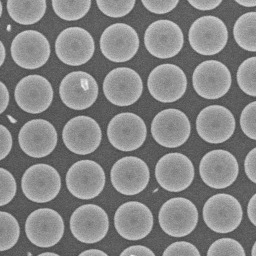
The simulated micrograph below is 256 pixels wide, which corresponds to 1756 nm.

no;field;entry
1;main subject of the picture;an array of small figures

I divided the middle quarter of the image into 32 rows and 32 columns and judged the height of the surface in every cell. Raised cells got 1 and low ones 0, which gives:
00000000000000000000000011110000
00000000000011111000001111111000
01111100000111111100001111111100
11111110001111111110011111111100
11111111001111111110011111111110
11111111001111111111011111111100
11111111001111111111011111111100
11111111001111111110001111111100
11111111000111111110000111111000
11111110000011111100000001000000
01111100000000000000000000000000
00000000000000000000000001110000
00000000000000111000000111111100
00111110000011111110000111111110
01111111000011111111001111111110
11111111100111111111001111111110
11111111100111111111101111111110
11111111100111111111001111111110
11111111100111111111000111111110
11111111100011111111000111111100
01111111000011111110000001111000
01111111000000111000000000000000
00001100000000000000000000111000
00000000000000011100000011111110
00001111000001111111000011111111
00111111100011111111100111111111
01111111110011111111100111111111
01111111110011111111100111111111
01111111110011111111100111111111
01111111110011111111100011111111
01111111110011111111000011111110
01111111100001111111000000111100